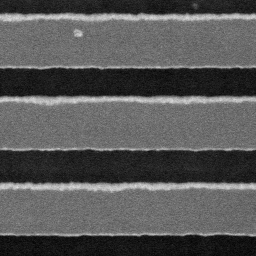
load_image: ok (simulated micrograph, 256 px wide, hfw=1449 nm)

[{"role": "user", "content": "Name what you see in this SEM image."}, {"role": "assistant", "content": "lines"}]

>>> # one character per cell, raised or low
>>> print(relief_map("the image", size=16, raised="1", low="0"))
0000000000000000
1111111111111111
1111111111111111
1111111111111111
0000000000000000
0000000000000000
1111111111111111
1111111111111111
1111111111111111
0000000000000000
0000000000000000
1101100011111111
1111111111111111
1111111111111111
1111111111111111
0000000000000000